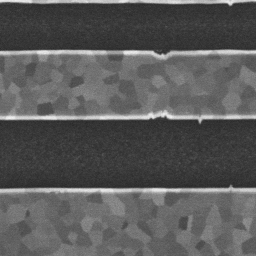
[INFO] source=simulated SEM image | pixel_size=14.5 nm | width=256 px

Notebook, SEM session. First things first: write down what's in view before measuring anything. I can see one or a few lines or trenches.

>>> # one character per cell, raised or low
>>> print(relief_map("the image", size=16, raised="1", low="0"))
0000000000000000
0000000000000000
0000000000000000
1111111111111111
1111111111111111
1111111111111111
1111111111111111
0000000000000000
0000000000000000
0000000000000000
0000000000000000
0000000000000000
1111111111111111
1111111111111111
1111111111111111
1111111111111111